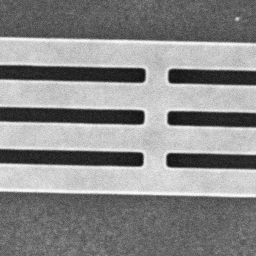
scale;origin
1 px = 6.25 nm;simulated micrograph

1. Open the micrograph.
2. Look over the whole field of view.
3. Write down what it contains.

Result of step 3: groups of lines, slits or small figures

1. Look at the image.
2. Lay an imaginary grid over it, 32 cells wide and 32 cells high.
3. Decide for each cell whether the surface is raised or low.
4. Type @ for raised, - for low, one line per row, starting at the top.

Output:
--------------------------------
--------------------------------
--------------------------------
--------------------------------
--------------------------------
@@@@@@@@@@@@@@@@@@@@@@@@@@@@@@@@
@@@@@@@@@@@@@@@@@@@@@@@@@@@@@@@@
@@@@@@@@@@@@@@@@@@@@@@@@@@@@@@@@
-----------------@@@@@@@@@@@@@@@
------------------@@@-----------
@@@@@@@@@@@@@@@@@@@@@@----------
@@@@@@@@@@@@@@@@@@@@@@@@@@@@@@@@
@@@@@@@@@@@@@@@@@@@@@@@@@@@@@@@@
---------@@@@@@@@@@@@@@@@@@@@@@@
------------------@@@-----------
@@@@@@@@@@--------@@@-----------
@@@@@@@@@@@@@@@@@@@@@@@@@@@@@@@@
@@@@@@@@@@@@@@@@@@@@@@@@@@@@@@@@
@@@@@@@@@@@@@@@@@@@@@@@@@@@@@@@@
------------------@@@-----------
@-----------------@@@-----------
@@@@@@@@@@@@@@@@@@@@@@@@@@@@@@@@
@@@@@@@@@@@@@@@@@@@@@@@@@@@@@@@@
@@@@@@@@@@@@@@@@@@@@@@@@@@@@@@@@
-------------------------------@
--------------------------------
--------------------------------
--------------------------------
--------------------------------
--------------------------------
--------------------------------
--------------------------------